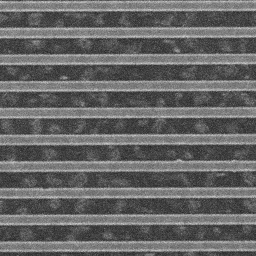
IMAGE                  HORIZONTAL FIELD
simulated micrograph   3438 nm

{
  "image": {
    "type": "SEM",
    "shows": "parallel lines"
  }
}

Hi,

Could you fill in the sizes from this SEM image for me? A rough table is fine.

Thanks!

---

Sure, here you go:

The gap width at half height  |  235 nanometers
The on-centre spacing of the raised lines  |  359 nanometers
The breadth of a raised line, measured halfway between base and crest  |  122 nm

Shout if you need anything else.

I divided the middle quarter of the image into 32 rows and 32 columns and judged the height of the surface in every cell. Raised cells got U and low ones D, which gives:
DDDDDDDDDDDDDDDDDDDDDDDDDDDDDDDD
DDDDDDDDDDDDDDDDDDDDDDDDDDDDDDDD
DDDDDDDDDDDDDDDDDDDDDDDDDDDDDDDD
DDDDDDDDDDDDDDDDDDDDDDDDDDDDDDDD
UUUUUUUUUUUUUUUUUUUUUUUUUUUUUUUU
UUUUUUUUUUUUUUUUUUUUUUUUUUUUUUUU
UUUUUDDDDDDDDDDDDDDDDDDDDDDDDDDD
DDDDDDDDDDDDDDDDDDDDDDDDDDDDDDDD
DDDDDDDDDDDDDDDDDDDDDDDDDDDDDDDD
DDDDDDDDDDDDDDDDDDDDDDDDDDDDDDDD
DDDDDDDDDDDDDDDDDDDDDDDDDDDDDDDD
UUUUUUUUUUUUUUUUUUUUUUUUUUUUUUUU
UUUUUUUUUUUUUUUUUUUUUUUUUUUUUUUU
DDDDDDDDDDDDDDDDDDDDDDDDDDDDDDDD
DDDDDDDDDDDDDDDDDDDDDDDDDDDDDDDD
DDDDDDDDDDDDDDDDDDDDDDDDDDDDDDDD
DDDDDDDDDDDDDDDDDDDDDDDDDDDDDDDD
DDDDDDDDDDDDDDDDDDDDDDDDDDDDDDDD
UUUUUUUUUUUUUUUUUUUUUUUUUUUUUUUU
UUUUUUUUUUUUUUUUUUUUUUUUUUUUUUUU
DDDDDDDDDDDDDDDDDDDDDDDDDDDDDDDD
DDDDDDDDDDDDDDDDDDDDDDDDDDDDDDDD
DDDDDDDDDDDDDDDDDDDDDDDDDDDDDDDD
DDDDDDDDDDDDDDDDDDDDDDDDDDDDDDDD
UUUUUUDDUDDUUDUUUUUDUUDUUUUUUUUU
UUUUUUUUUUUUUUUUUUUUUUUUUUUUUUUU
UUUUUUUUUUUUUUDDDDDDUUDDDDDDDDDD
DDDDDDDDDDDDDDDDDDDDDDDDDDDDDDDD
DDDDDDDDDDDDDDDDDDDDDDDDDDDDDDDD
DDDDDDDDDDDDDDDDDDDDDDDDDDDDDDDD
DDDDDDDDDDDDDDDDDDDDDDDDDDDDDDDD
UUUUUUUUUUUUUUUUUUUUUUUUUUUUUUUU